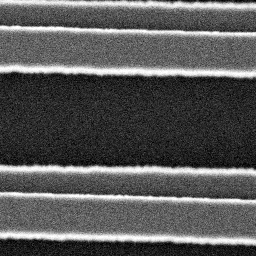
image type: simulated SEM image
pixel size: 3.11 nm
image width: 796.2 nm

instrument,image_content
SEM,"lines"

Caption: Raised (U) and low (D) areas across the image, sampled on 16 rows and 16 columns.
UUUUUUUUUUUUUUUU
UUUUUUUUUUUUUUUU
UUUUUUUUUUUUUUUU
UUUUUUUUUUUUUUUU
DDDDDDDDDUUUUUUU
DDDDDDDDDDDDDDDD
DDDDDDDDDDDDDDDD
DDDDDDDDDDDDDDDD
DDDDDDDDDDDDDDDD
DDDDDDDDDDDDDDDD
DDDDDDDDDDDDDDDD
UUUUUUUUUUUUUUUU
UUUUUUUUUUUUUUUU
UUUUUUUUUUUUUUUU
UUUUUUUUUUUUUUUU
DDDDDDDDDDDDDDDD